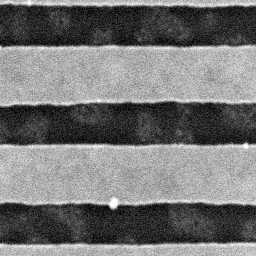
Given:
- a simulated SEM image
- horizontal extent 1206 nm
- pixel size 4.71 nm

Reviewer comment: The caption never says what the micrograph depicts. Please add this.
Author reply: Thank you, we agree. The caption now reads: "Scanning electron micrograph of lines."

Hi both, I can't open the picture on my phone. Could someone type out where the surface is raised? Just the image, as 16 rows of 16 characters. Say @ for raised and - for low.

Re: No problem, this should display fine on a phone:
----------------
----------------
----------------
@@@@@@@@@@@@@@@@
@@@@@@@@@@@@@@@@
@@@@@@@@@@@@@@@@
@-@@@-----------
----------------
----------------
@@@@@@@@@@@@@@@@
@@@@@@@@@@@@@@@@
@@@@@@@@@@@@@@@@
@@@@@@@@@@@@@@@@
----------------
----------------
@@@@@@@@@@@@@@@@